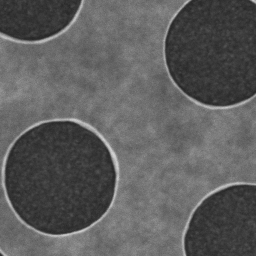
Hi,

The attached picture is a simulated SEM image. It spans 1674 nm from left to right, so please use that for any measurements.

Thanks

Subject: holes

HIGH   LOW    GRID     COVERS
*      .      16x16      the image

.....******.....
....*******.....
*.********......
**********......
***********.....
***********.....
*************..*
****************
*.....**********
*......*********
.......*********
.......*********
*......******...
*.....******....
***..*******....
************....